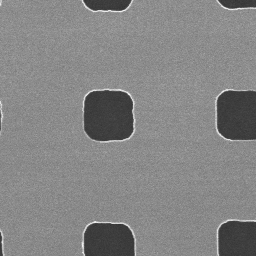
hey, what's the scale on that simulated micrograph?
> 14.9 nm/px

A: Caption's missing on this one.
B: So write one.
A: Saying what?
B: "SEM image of holes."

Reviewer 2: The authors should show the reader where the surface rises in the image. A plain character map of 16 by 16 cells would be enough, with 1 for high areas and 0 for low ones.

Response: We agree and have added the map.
1111110011111100
1111111111111111
1111111111111111
1111111111111111
1111111111111111
1111111111111111
1111100011111100
1111100011111100
1111110011111100
1111111111111111
1111111111111111
1111111111111111
1111111111111111
1111111111111111
1111100011111100
1111100011111100